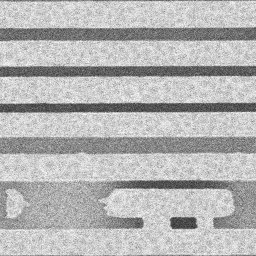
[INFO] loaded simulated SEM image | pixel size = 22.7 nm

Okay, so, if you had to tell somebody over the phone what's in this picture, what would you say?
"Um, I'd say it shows parallel lines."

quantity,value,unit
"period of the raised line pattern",0.862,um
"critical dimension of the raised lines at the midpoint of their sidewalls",0.604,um